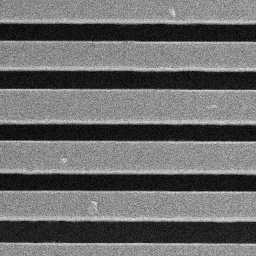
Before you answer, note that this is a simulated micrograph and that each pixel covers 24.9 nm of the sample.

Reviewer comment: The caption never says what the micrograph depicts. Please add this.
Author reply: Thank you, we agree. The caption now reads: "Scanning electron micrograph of lines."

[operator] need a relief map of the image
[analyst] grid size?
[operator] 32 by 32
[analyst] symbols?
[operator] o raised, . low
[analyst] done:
oooooooooooooooooooooooooooooooo
oooooooooooooooooooooooooooooooo
oooooooooooooooooooooooooooooooo
................................
................................
oooooooooooooooooooooooooooooooo
oooooooooooooooooooooooooooooooo
oooooooooooooooooooooooooooooooo
oooooooooooooooooooooooooooooooo
................................
................................
oooooooooooooooooooooooooooooooo
oooooooooooooooooooooooooooooooo
oooooooooooooooooooooooooooooooo
oooooooooooooooooooooooooooooooo
oooooooooooooooooooooooooooooooo
................................
................................
oooooooooooooooooooooooooooooooo
oooooooooooooooooooooooooooooooo
oooooooooooooooooooooooooooooooo
oooooooooooooooooooooooooooooooo
................................
................................
oooooooooooooooooooooooooooooooo
oooooooooooooooooooooooooooooooo
oooooooooooooooooooooooooooooooo
oooooooooooooooooooooooooooooooo
................................
................................
oooooooooooooooooooooooooooooooo
oooooooooooooooooooooooooooooooo